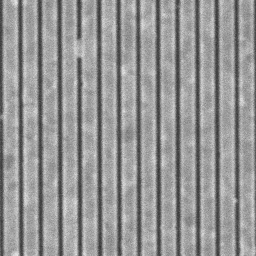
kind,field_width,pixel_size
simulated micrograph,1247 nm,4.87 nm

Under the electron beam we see parallel lines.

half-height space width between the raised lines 29.8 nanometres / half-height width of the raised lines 63.9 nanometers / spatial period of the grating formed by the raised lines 95.8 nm